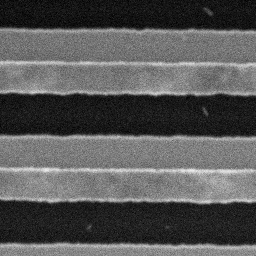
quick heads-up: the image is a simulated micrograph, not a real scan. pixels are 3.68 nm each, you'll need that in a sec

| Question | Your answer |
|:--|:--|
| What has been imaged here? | lines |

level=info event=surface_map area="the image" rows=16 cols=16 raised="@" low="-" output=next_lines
----------------
----------------
@@@@@@@@@@@@@@@@
@@@@@@@@@@@@@@@@
@@@@@@@@@@@@@@@@
@@@@@@@@@@@@@@@@
----------------
----------------
----------------
@@@@@@@@@@@@@@@@
@@@@@@@@@@@@@@@@
@@@@@@@@@@@@@@@@
-@@@@@@@@@@@@@@@
----------------
----------------
@@@@@@@@@@@@@@@@